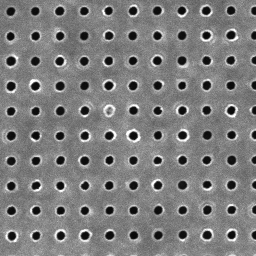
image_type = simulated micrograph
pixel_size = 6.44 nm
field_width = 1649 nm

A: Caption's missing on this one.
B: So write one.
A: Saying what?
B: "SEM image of a regular array of holes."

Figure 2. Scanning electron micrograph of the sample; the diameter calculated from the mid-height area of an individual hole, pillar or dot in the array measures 8.6 pixels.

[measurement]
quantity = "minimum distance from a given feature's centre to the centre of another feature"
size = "156 nm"